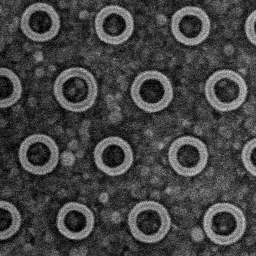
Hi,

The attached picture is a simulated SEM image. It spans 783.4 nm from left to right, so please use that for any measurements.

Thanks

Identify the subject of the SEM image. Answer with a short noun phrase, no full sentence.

a regular array of ring-shaped raised bodies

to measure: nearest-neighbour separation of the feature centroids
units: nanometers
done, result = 227